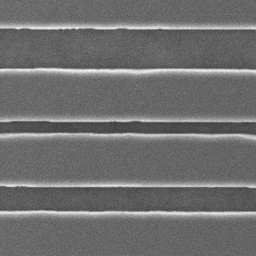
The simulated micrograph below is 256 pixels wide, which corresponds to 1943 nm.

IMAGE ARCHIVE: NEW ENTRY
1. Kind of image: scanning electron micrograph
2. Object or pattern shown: lines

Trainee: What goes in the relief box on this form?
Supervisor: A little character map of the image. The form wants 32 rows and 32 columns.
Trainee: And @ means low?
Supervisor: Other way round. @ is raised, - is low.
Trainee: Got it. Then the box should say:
@@@@@@@@@@@@@@@@@@@@@@@@@@@@@@@@
@@@@@@@@@@@@@@@@@@@@@@@@@@@@@@@@
@@@@@@@@@@@@@@@@@@@@@@@@@@@@@@@@
--@-@@@@@---@@@-@@@@@@@@@@@@@@@@
--------------------------------
--------------------------------
--------------------------------
--------------------------------
--------------------------------
@@@@@@@@@@@@@@@@@@@@@@@@@@@@@@@@
@@@@@@@@@@@@@@@@@@@@@@@@@@@@@@@@
@@@@@@@@@@@@@@@@@@@@@@@@@@@@@@@@
@@@@@@@@@@@@@@@@@@@@@@@@@@@@@@@@
@@@@@@@@@@@@@@@@@@@@@@@@@@@@@@@@
@@@@@@@@@@@@@@@@@@@@@@@@@@@@@@@@
--------------------------------
--------------------------------
@@@@@@@@@@@@@@@@@@@@@@@@@@@@@@@@
@@@@@@@@@@@@@@@@@@@@@@@@@@@@@@@@
@@@@@@@@@@@@@@@@@@@@@@@@@@@@@@@@
@@@@@@@@@@@@@@@@@@@@@@@@@@@@@@@@
@@@@@@@@@@@@@@@@@@@@@@@@@@@@@@@@
@@@@@@@@@@@@@@@@@@@@@@@@@@@@@@@@
--------------------------------
--------------------------------
--------------------------------
----@@--------------------------
@@@@@@@@@@@@@@@@@@@@@@@@@@@@@@@@
@@@@@@@@@@@@@@@@@@@@@@@@@@@@@@@@
@@@@@@@@@@@@@@@@@@@@@@@@@@@@@@@@
@@@@@@@@@@@@@@@@@@@@@@@@@@@@@@@@
@@@@@@@@@@@@@@@@@@@@@@@@@@@@@@@@